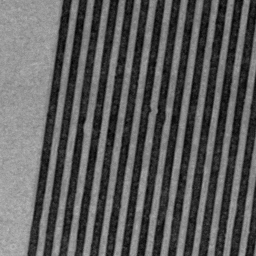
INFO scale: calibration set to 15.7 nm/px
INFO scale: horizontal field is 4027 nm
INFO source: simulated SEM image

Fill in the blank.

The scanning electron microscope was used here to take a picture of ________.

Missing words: parallel lines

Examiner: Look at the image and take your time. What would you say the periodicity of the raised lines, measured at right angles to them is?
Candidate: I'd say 242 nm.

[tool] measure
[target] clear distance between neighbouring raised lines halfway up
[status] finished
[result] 160 nanometres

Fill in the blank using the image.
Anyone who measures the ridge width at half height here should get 79.8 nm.